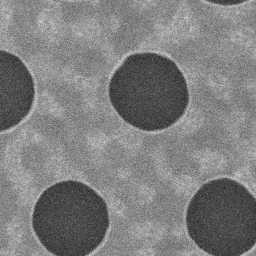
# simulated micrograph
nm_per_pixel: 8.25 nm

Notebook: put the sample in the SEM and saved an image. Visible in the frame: holes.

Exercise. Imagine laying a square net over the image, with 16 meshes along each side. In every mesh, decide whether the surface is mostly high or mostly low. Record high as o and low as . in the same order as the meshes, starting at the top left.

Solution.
oooooooooooooooo
oooooooooooooooo
oooooooooooooooo
.ooooooo..oooooo
..ooooo....ooooo
..ooooo.....oooo
..ooooo.....oooo
.ooooooo...ooooo
oooooooooooooooo
oooooooooooooooo
oooooooooooooooo
ooo..oooooooo..o
oo....oooooo....
oo.....ooooo....
oo.....ooooo....
ooo...ooooooo...